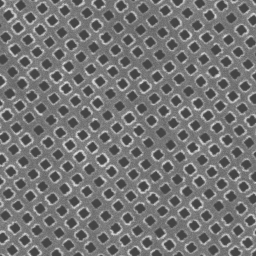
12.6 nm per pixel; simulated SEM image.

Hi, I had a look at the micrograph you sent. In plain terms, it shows a regular array of holes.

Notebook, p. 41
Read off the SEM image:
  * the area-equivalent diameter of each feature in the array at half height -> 120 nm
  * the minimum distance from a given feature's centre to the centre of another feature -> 194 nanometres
